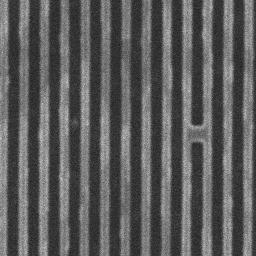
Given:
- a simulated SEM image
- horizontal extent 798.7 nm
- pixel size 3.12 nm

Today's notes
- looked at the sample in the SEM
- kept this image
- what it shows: parallel lines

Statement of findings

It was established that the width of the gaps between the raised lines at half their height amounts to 12.2 px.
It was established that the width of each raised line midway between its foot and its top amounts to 23.4 nm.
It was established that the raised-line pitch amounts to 20.4 px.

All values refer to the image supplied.